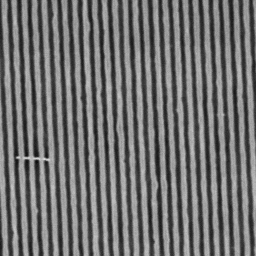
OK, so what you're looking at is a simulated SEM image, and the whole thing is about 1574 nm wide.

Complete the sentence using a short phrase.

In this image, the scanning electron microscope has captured parallel lines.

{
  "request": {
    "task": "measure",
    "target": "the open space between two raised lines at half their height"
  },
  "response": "32.3 nm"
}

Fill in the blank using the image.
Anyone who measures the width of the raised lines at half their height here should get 0.0323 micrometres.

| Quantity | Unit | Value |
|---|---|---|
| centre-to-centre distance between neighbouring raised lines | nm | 61.9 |